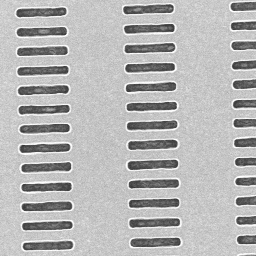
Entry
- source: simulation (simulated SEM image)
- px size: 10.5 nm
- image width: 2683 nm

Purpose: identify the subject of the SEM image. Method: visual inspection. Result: a regular array of holes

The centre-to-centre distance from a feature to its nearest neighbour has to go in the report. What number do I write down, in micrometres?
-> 0.201